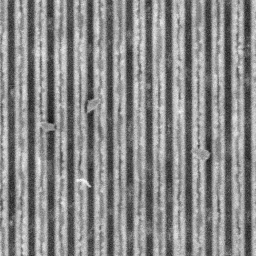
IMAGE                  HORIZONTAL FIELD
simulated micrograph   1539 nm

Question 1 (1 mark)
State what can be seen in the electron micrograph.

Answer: parallel lines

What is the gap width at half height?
65.4 nm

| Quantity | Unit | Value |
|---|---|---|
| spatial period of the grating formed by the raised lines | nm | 118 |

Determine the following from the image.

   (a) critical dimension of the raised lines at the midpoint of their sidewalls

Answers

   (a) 53.4 nm